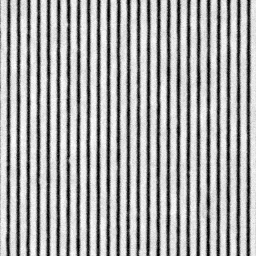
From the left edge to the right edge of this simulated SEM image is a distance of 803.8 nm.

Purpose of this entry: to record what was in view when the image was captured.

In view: parallel lines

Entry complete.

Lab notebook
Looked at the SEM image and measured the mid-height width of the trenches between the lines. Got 12.6 nanometres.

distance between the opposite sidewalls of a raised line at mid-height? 0.0188 micrometres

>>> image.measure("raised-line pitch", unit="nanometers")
31.4